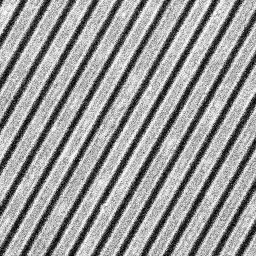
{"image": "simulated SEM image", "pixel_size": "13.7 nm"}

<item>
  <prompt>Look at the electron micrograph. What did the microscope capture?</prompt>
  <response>parallel lines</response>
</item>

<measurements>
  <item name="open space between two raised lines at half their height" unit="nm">130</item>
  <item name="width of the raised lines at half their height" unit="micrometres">0.152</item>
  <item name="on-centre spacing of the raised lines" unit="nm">286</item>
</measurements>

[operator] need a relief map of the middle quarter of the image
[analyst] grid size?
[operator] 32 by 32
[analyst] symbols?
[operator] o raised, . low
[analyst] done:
...ooo...ooo...ooo...ooo...ooo..
..oooo...ooo...ooo...ooo...ooo..
..ooo...ooo...ooo...ooo...ooo...
.oooo..oooo..ooo....ooo..oooo..o
.ooo...ooo...ooo...ooo...ooo...o
oooo..ooo...ooo...oooo..ooo...oo
ooo...ooo...ooo...ooo...ooo...oo
oo...ooo...ooo...ooo...ooo...ooo
oo...ooo...ooo...ooo...ooo...ooo
o...ooo...ooo...ooo...ooo...ooo.
o...ooo..oooo...ooo..oooo..ooo..
...ooo...ooo...ooo...ooo...ooo..
..ooo...ooo...oooo..ooo...ooo...
..ooo...ooo...ooo...ooo...ooo...
.ooo...ooo...ooo...ooo...ooo...o
.ooo...ooo...ooo...ooo...ooo...o
ooo...ooo...ooo...ooo...ooo...oo
ooo..oooo...ooo...ooo..oooo...oo
oo...ooo...ooo...ooo...ooo...ooo
o...ooo...oooo..ooo...ooo...oooo
o...ooo...ooo...ooo...ooo...ooo.
...ooo...ooo...ooo...ooo...ooo..
...ooo...ooo...ooo...ooo...ooo..
..ooo...ooo...ooo...ooo...ooo...
.oooo...ooo...ooo..oooo...ooo..o
.ooo...ooo...ooo...ooo...ooo...o
ooo...oooo..ooo...ooo...oooo..oo
ooo...ooo...ooo...ooo...ooo...oo
oo...ooo...ooo...oooo..ooo...ooo
oo...ooo...ooo...ooo...ooo...ooo
o...ooo...ooo...ooo...ooo...ooo.
o...ooo...ooo..oooo...ooo...ooo.